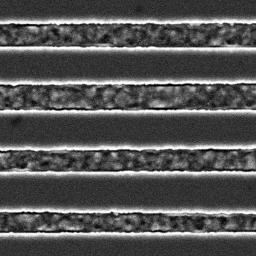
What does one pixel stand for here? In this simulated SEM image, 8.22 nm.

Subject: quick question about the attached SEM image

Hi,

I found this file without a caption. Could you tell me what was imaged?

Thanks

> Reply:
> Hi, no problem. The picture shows lines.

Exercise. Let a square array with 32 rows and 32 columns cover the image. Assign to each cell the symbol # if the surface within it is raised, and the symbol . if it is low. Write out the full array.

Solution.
################################
################################
################################
................................
................................
................................
################################
################################
################################
################################
.##.##.#...##.#.................
................................
................................
................................
################################
################################
################################
################################
################################
................................
................................
.#.............###.#####.#####.#
################################
################################
################################
################################
.......#######.#################
................................
................................
################################
################################
################################